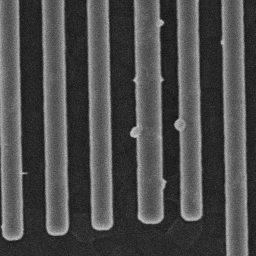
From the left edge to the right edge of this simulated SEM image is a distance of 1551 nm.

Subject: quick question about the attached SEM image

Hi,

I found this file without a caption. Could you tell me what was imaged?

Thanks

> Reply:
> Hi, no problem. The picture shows parallel lines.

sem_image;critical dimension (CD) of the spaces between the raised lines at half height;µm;0.145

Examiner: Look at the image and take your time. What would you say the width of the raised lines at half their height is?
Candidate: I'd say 129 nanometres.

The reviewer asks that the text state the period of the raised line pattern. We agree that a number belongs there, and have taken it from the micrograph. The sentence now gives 272 nm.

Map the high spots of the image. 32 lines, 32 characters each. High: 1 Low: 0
11000111000111000111001110001100
11000111000110000111001110001100
11000111000111000111001110001100
11000111000111000111001110001100
11000111000111000111001110001100
11000111000111000111001110001100
11000111000111000111001110001100
11000111000111000111001110001100
11000111000111000111001110001100
11000111000111000111001110001110
11000111000111000111001110001110
11100111000111000111001110001110
11100011000111000111001110001110
11100011000111000111001110001110
11100011000111000111001110001110
11100011000111000111001110001110
11100011000111001111001110001110
11100011000111000111001110001110
11100011000111000111000110001110
11100011000111000111000110001110
11100011000111000111000110001110
11100011000111000111000110001110
11100011000111000111100110001110
11100011000111000111000110001110
11100011100111000111000110001110
11100011000011000111000110001110
11100011000011000111000110001110
11100011000011000011000000001110
11100011000011000000000000001110
11100000000000000000000000001110
00000000000000000000000000001110
00000000000000000000000000001110